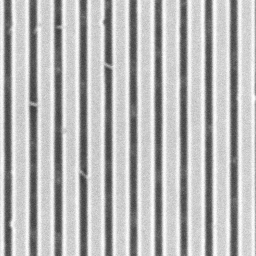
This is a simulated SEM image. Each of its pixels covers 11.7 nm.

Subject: parallel lines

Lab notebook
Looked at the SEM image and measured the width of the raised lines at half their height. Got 180 nm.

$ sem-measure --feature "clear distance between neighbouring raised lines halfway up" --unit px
9.62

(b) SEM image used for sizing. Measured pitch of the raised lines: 295 nanometers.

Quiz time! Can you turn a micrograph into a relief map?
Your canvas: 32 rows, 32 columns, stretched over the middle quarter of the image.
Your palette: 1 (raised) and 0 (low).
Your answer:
11100011110111110001110001110001
11100011110011110001110001110001
11100011110011110001110001110001
11100011110011110001110001110001
11100011110011110001110001110001
11100011110011110001110001110001
11100011110011110001110001110001
11100011110011110001110001110001
11100011110011110001110001110001
11100011110011110001110001110001
11100011110011110001110001110001
11100011110011110001110001110001
11100011110011110001110001110001
11100011110011110001110001110001
11100011110011110001110001110001
11100011110011110001110001110001
11100011110011110001110001110001
11100011110011110001110001110001
11100011110011110001110001110001
11100011110011110001110001111001
11100011110011110001110001111001
11100011110011110001110001111001
11100011110011110001110001111001
11100011110011110001110001111001
11100011110011110001110001111001
11100011110011110001110001111001
11110011110011110001110001111001
11100011110011110001110001111001
11100011110011110001110001111001
11100011110011110001110001111001
11100011110011110001110001111001
11100011110011110001110001111001